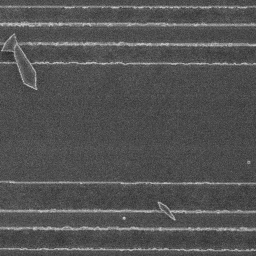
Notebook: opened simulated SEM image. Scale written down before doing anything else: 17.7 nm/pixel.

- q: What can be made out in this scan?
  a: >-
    lines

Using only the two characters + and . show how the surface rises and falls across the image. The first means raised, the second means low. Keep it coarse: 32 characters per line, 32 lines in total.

++++++++++++++++++++++++++++++++
................................
................................
++++++++++++++++++++++++++++++++
++++++++++++++++++++++++++++++++
+++.............++++++++++++++++
.++.............................
..+.............................
++++++++++++++++++++++++++++++++
++++++++++++++++++++++++++++++++
++++++++++++++++++++++++++++++++
++++++++++++++++++++++++++++++++
++++++++++++++++++++++++++++++++
++++++++++++++++++++++++++++++++
++++++++++++++++++++++++++++++++
++++++++++++++++++++++++++++++++
++++++++++++++++++++++++++++++++
++++++++++++++++++++++++++++++++
++++++++++++++++++++++++++++++++
++++++++++++++++++++++++++++++++
++++++++++++++++++++++++++++++++
++++++++++++++++++++++++++++++++
++++++++++++++++++++++++++++++++
................................
................................
................................
++++++++++++++++++++++++++++++++
++++++++++++++++++++++++++++++++
++++++++++++++++++++++++++++++++
................................
................................
++++++++++++++++++++++++++++++++